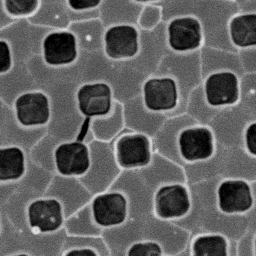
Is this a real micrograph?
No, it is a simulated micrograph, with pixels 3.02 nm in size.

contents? a regular array of holes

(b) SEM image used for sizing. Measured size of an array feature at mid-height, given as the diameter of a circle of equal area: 103 nm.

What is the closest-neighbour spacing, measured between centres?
188 nanometers